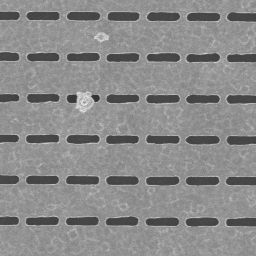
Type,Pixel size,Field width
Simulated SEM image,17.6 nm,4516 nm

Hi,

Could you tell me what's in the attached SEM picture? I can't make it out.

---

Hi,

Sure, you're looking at a regular array of holes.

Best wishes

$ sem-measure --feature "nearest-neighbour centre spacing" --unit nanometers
702